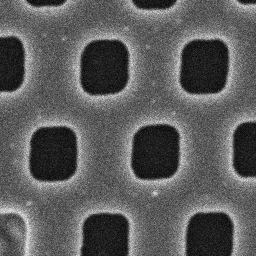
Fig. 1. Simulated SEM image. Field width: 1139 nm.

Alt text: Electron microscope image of holes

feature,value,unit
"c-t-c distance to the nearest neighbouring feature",98.6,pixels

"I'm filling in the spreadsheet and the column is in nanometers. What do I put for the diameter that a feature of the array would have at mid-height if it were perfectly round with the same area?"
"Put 250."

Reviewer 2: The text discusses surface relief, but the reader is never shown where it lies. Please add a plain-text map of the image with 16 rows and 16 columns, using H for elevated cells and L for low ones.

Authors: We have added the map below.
HHHHHHHHHLLHHHHH
HHHHHHHHHHHHHHHH
LHHHHHLHHHHHLLHH
LLHHHLLLHHHLLLHH
LLHHHLLLHHHLLLHH
LHHHHLLLHHHLLLHH
HHHHHHHHHHHHHHHH
HHHHHHHHHHHHHHHH
HHLLLHHHLLLHHHHL
HHLLLHHHLLLHHHHL
HHLLLHHHLLLHHHHL
HHHHHHHHHHHHHHHH
HHHHHHHHHHHHHHHH
HHHHHHLLHHHHLLHH
HHHHHLLLHHHHLLLH
HHHHHLLLHHHHLLLH